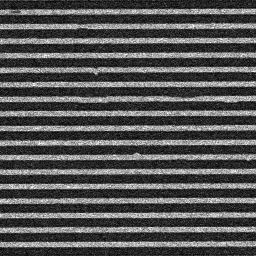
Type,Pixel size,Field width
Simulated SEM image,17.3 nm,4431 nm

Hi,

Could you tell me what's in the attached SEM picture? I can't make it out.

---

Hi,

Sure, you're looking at parallel lines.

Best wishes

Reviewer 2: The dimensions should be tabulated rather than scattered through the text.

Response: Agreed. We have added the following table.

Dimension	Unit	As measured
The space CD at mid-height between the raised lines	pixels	8.38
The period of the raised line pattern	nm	252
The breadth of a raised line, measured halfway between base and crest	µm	0.0974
